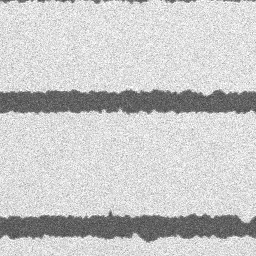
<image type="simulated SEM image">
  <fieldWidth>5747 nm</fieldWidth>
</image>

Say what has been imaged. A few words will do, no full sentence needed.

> one or a few lines or trenches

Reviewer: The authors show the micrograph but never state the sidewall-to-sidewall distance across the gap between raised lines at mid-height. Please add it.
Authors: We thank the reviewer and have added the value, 2200 nm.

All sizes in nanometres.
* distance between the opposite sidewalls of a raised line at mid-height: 515